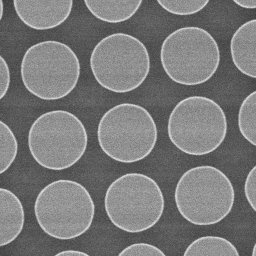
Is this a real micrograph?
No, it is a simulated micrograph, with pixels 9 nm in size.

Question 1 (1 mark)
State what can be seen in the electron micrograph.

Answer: an array of small figures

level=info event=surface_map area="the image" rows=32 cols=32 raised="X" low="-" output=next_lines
--XXXXXXX--XXXXXXX--XXXXXX----XX
--XXXXXXX--XXXXXX----XXX--------
---XXXXX-----XXX----------------
----XX-----------------XX-----XX
--------------XX-----XXXXX---XXX
-----XXX----XXXXXX--XXXXXXX--XXX
---XXXXXX---XXXXXX--XXXXXXX--XXX
---XXXXXXX-XXXXXXXX-XXXXXXX--XXX
X--XXXXXXX-XXXXXXXX--XXXXXX---XX
X--XXXXXXX--XXXXXX---XXXXX-----X
X--XXXXXX----XXXX------X--------
X---XXXXX-----------------------
-----------------------XXX-----X
--------------XXXX----XXXXX---XX
-----XXXX----XXXXXX--XXXXXXX--XX
X---XXXXXX--XXXXXXX--XXXXXXX--XX
X---XXXXXXX-XXXXXXX--XXXXXXX--XX
XX--XXXXXXX-XXXXXXX--XXXXXXX---X
XX--XXXXXXX--XXXXXX---XXXXX-----
XX--XXXXXX----XXXX--------------
X----XXXX-----------------------
-----------------------XXXXX---X
---------------XXXX----XXXXXX--X
------XXXX----XXXXXX--XXXXXXX--X
XX---XXXXXX--XXXXXXX--XXXXXXX--X
XXX-XXXXXXXX-XXXXXXX--XXXXXXX--X
XXX-XXXXXXXX-XXXXXXX---XXXXXX---
XXX--XXXXXX---XXXXXX----XXXX----
XXX--XXXXXX----XXX--------------
XX-----XXX----------------------
X----------------X------XXXXX---
--------XX-----XXXXX---XXXXXXX--